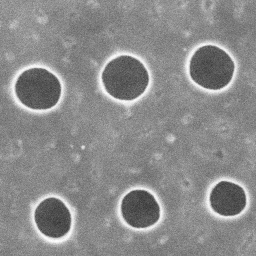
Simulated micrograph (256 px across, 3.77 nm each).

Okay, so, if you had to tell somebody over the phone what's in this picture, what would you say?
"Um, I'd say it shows holes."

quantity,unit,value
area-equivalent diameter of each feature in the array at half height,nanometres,158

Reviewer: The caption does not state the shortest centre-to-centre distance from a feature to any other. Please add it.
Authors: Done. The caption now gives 329 nanometres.